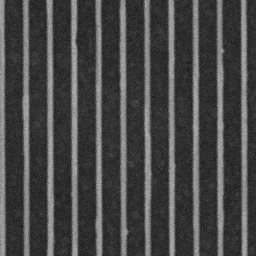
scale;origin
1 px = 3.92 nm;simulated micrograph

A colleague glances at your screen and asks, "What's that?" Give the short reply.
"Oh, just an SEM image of parallel lines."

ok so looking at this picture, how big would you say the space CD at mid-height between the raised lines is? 0.0754 microns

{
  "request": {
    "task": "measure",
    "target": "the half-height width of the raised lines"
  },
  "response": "20.6 nm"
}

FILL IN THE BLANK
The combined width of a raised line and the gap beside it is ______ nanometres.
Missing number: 95